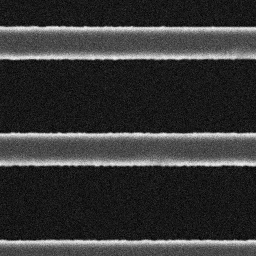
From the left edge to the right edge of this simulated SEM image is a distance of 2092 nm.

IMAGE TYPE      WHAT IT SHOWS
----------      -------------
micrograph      lines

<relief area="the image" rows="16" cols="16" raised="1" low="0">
0000000000000000
0000000000000000
1111111111111111
1111111111111111
0000000000000000
0000000000000000
0000000000000000
0000000000000000
1111111111111111
1111111111111111
0000000000000000
0000000000000000
0000000000000000
0000000000000000
0000000000000000
1111111111111111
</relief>